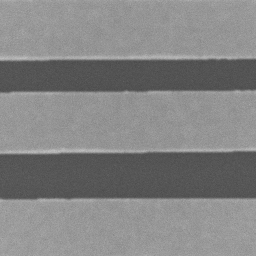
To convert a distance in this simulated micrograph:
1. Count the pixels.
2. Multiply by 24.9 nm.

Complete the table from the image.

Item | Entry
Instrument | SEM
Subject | lines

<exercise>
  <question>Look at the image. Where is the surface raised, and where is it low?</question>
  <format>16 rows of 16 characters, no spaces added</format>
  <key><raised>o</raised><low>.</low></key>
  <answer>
oooooooooooooooo
oooooooooooooooo
oooooooooooooooo
oooooooooooooooo
................
................
oooooooooooooooo
oooooooooooooooo
oooooooooooooooo
oooo............
................
................
..oooooooooooooo
oooooooooooooooo
oooooooooooooooo
oooooooooooooooo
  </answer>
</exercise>